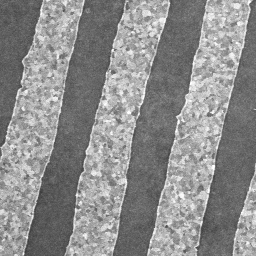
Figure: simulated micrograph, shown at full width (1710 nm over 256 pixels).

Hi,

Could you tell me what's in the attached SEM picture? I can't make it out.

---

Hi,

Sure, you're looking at one or a few lines or trenches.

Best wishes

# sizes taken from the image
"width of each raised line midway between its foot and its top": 286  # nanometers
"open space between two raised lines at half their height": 257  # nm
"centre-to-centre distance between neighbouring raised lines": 546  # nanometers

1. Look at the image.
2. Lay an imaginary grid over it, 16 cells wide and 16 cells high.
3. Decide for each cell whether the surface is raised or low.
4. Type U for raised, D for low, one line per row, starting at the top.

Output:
DDDUUDDDUUUDDUUU
DDUUUDDUUUDDDUUD
DDUUUDDUUUDDDUUD
DDUUDDDUUUDDUUUD
DUUUDDDUUDDDUUUD
DUUUDDDUUDDDUUUD
DUUUDDUUUDDDUUDD
DUUUDDUUUDDUUUDD
UUUDDDUUDDDUUUDD
UUUDDUUUDDDUUUDD
UUUDDUUUDDDUUDDD
UUUDDUUUDDUUUDDD
UUDDDUUUDDUUUDDU
UUDDDUUDDDUUUDDU
UUDDDUUDDDUUUDDU
UUDDUUUDDUUUDDDU